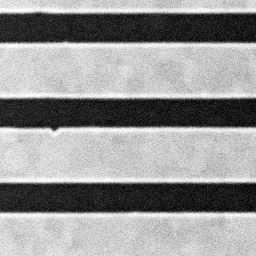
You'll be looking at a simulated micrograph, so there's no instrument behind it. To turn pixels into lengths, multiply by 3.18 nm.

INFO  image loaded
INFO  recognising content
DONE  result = one or a few lines or trenches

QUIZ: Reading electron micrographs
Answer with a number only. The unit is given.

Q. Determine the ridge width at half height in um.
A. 0.167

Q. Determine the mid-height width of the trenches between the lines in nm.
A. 103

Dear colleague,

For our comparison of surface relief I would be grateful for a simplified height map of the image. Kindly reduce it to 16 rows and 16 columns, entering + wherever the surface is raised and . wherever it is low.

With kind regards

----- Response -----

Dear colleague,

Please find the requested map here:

++++++++++++++++
................
................
++++++++++++++++
++++++++++++++++
++++++++++++++++
................
................
++++++++++++++++
++++++++++++++++
++++++++++++++++
................
................
++++++++++++++++
++++++++++++++++
++++++++++++++++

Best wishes